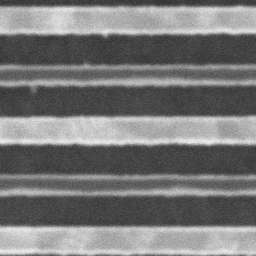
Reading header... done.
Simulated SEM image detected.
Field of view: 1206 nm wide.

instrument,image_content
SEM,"lines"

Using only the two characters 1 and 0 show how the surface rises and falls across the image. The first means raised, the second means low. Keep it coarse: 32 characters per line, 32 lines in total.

00000000000000000000000000000000
11111111111111111111111111111111
11111111111111111111111111111111
11111111111111111111111111111111
00000000000000000000000000000000
00000000000000000000000000000000
00000000000000000000000000000000
00000000000000000000000000000000
11111111111111111111111111111111
11111111111111111111111111111111
11111111111111111111101111111111
00000000000000000000000000000000
00000000000000000000000000000000
00000000000000000000000000000000
00000000000000000000000000000000
11111111111111111111111111111111
11111111111111111111111111111111
11111111111111111111111111111111
00000000000000000000000000000000
00000000000000000000000000000000
00000000000000000000000000000000
00000000000000000000000000000000
11111111111111111111111111111111
11111111111111111111111111111111
00000000000000000000000000000000
00000000000000000000000000000000
00000000000000000000000000000000
00000000000000000000000000000000
00000001111111111100011000100010
11111111111111111111111111111111
11111111111111111111111111111111
11111111111111111111111111111111